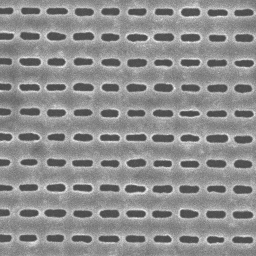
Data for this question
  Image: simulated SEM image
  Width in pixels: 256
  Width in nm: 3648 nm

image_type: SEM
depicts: a regular array of holes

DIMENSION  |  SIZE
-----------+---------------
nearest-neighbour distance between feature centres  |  355 nm